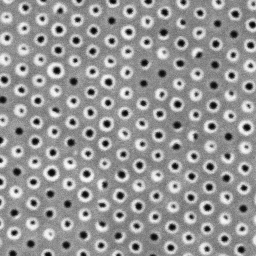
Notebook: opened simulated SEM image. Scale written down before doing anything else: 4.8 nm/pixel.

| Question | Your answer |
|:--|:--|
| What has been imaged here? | a regular array of holes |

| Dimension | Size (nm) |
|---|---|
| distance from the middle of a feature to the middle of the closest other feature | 94.4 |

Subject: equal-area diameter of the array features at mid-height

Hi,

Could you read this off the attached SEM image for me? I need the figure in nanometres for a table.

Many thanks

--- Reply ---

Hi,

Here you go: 34.7